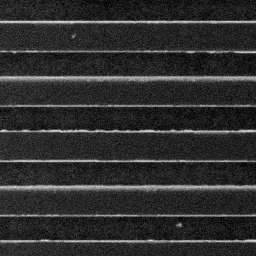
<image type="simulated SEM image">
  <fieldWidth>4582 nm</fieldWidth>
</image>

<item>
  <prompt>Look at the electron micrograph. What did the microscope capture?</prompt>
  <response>lines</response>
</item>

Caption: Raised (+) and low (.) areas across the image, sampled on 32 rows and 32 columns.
................................
................................
................................
++++++++++++++++++++++++++++++++
++++++++++++++++++++++++++++++++
++++++++++++++++++++++++++++++++
.......................++.+..+++
................................
................................
................................
++++++++++++++++++++++++++++++++
++++++++++++++++++++++++++++++++
++++++++++++++++++++++++++++++++
................................
................................
................................
++++++++++++++++++++++++++++++++
++++++++++++++++++++++++++++++++
++++++++++++++++++++++++++++++++
++++++++++++++++++++++++++++++++
................................
................................
................................
++++++++++++++++++++++++++++++++
++++++++++++++++++++++++++++++++
++++++++++++++++++++++++++++++++
++++++++++++++++++++++++++++++++
................................
................................
................................
++++++++++++++++++++++++++++++++
++++++++++++++++++++++++++++++++